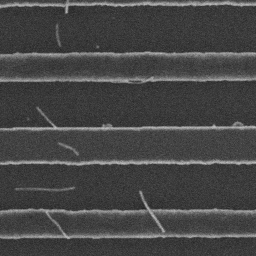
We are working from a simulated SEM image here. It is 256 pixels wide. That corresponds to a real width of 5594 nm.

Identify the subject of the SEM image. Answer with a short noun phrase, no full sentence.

lines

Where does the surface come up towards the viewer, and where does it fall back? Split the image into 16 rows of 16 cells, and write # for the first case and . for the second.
................
................
................
################
################
................
................
................
################
################
................
................
................
################
################
................